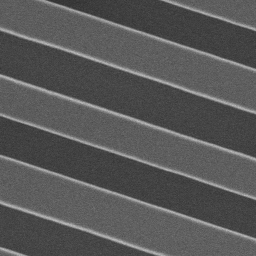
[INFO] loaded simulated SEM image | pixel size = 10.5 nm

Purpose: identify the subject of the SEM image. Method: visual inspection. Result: lines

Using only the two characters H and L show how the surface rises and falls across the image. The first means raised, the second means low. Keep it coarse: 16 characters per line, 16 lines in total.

HHHHLLLLLLLLHHHH
HHHHHHHLLLLLLLLH
LLHHHHHHHHLLLLLL
LLLLLHHHHHHHHLLL
LLLLLLLLHHHHHHHH
HHLLLLLLLLLHHHHH
HHHHHLLLLLLLLLHH
LHHHHHHHHLLLLLLL
LLLLHHHHHHHHLLLL
LLLLLLLHHHHHHHHL
HHLLLLLLLLHHHHHH
HHHHHHLLLLLLLHHH
HHHHHHHHHLLLLLLL
LLHHHHHHHHHHLLLL
LLLLLLHHHHHHHHHL
LLLLLLLLLHHHHHHH